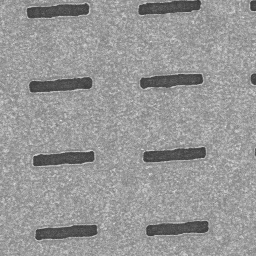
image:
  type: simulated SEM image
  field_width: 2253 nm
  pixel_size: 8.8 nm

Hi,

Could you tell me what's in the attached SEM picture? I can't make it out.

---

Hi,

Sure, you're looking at holes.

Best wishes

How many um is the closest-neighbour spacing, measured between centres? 0.649